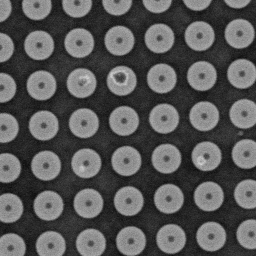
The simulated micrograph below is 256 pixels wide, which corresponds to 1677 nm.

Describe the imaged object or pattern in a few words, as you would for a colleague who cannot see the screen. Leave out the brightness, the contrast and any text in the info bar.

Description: an array of small figures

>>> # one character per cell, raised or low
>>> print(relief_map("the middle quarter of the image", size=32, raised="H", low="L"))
LLLLLLLLLLLLLLLLLLLLLLHHHHLLLLLL
LLLHHHLLLLLLHHHHHLLLLLHHHHHLLLLH
LHHHHHHLLLLHHHHHHHLLLHHHHHHHLLLH
LHHHHHHHLLLHHHHHHHLLLHHHHHHHLLLH
LHHHHHHHLLLHHHHHHHLLLHHHHHHHLLLH
LHHHHHHHLLLHHHHHHHLLLHHHHHHHLLLL
LHHHHHHHLLLLHHHHHLLLLLHHHHHLLLLL
LLHHHHHLLLLLLHHHLLLLLLLLLLLLLLLL
LLLLLLLLLLLLLLLLLLLLLLLLLLLLLLLL
LLLLLLLLLLLLLLLLLLLLLLLLLLLLLLLL
LLLLLLLLLLLLLLLLLLLLLLLHHHHLLLLL
LLLHHHHLLLLLLHHHHLLLLLHHHHHHLLLL
LLHHHHHHLLLLHHHHHHLLLLHHHHHHLLLH
LLHHHHHHLLLHHHHHHHHLLHHHHHHHHLLH
LHHHHHHHHLLHHHHHHHHLLHHHHHHHHLLL
LHHHHHHHHLLLHHHHHHLLLLHHHHHHLLLL
LLHHHHHHLLLLHHHHHHLLLLLHHHHLLLLL
LLHHHHHLLLLLLHHHHLLLLLLLLLLLLLLL
LLLLLLLLLLLLLLLLLLLLLLLLLLLLLLLL
LLLLLLLLLLLLLLLLLLLLLLLLLLLLLLLL
LLLLLLLLLLLLLLLLLLLLLLLLHHHLLLLL
LLLLHHHLLLLLLHHHHHLLLLLHHHHHHLLL
LLLHHHHHLLLLHHHHHHHLLLHHHHHHHLLL
LLHHHHHHHLLLHHHHHHHLLLHHHHHHHLLL
LLHHHHHHHLLLHHHHHHHLLLHHHHHHHLLL
LLHHHHHHHLLLHHHHHHHLLLHHHHHHHLLL
LLHHHHHHHLLLLHHHHHHLLLLHHHHHLLLL
LLLHHHHHLLLLLLHHHLLLLLLLLLLLLLLL
LLLLLLLLLLLLLLLLLLLLLLLLLLLLLLLL
LLLLLLLLLLLLLLLLLLLLLLLLLLLLLLLL
LLLLLLLLLLLLLLLLLLLLLLLLLHHHLLLL
LLLLLHHLLLLLLLHHHHLLLLLHHHHHHLLL